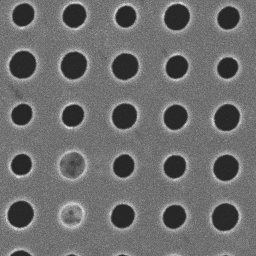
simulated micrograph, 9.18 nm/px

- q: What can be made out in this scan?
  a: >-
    a regular array of holes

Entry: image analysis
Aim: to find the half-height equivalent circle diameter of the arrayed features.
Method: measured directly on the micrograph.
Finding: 220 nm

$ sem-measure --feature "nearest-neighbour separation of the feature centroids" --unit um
0.457